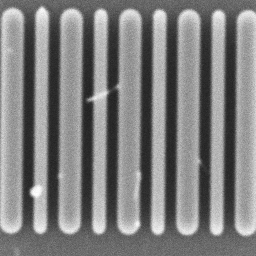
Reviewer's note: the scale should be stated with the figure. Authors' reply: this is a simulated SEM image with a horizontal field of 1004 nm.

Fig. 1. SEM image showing groups of lines, slits or small figures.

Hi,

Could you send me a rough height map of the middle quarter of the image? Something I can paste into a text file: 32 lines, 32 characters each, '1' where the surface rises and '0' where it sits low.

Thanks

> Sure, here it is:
11110000111000111110000110000111
11110000111000111110000110000111
11110000111000111110001110000111
11110000111000111110001110000111
11110000111000111110001110000111
11110000111001111110001110000111
11110000111000111110001110000111
11110000111000111110001110000111
11110001111000111110001110000111
11110000111000111110001110000111
11110000111000111110001110000111
11110000111000111110001110000111
11110000111000111110001110000111
11110000111000111110001110000111
11110000111000111110001110000111
11110000111000111110001110000111
11110000111000111110001110000111
11110000111000111110001110000111
11110000111000111110001110000111
11110000110000111110001110000111
11110000110000111110001110000111
11110000110000111110001110000111
11110000110000111110001110000111
11110000110000111110001110000111
11110000110000111110001110000111
11110000110000111110001110000111
11110000110000111110001110001111
11110000110000111110001110001111
11110000110000111110001110001111
11110000110000111110001110001111
11110000110000111110001110001111
11110000110000111110001110001111